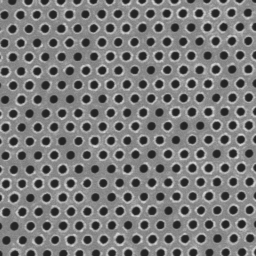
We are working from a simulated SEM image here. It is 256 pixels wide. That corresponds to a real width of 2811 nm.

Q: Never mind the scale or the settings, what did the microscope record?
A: a regular array of holes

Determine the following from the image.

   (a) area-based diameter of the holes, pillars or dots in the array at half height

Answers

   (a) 91 nm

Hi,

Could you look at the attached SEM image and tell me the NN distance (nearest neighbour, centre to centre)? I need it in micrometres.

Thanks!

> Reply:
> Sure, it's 0.175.